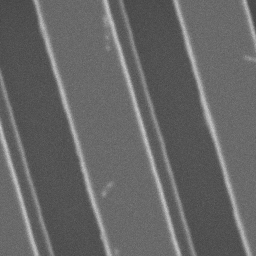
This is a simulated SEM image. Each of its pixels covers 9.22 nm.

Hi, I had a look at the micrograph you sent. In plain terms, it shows lines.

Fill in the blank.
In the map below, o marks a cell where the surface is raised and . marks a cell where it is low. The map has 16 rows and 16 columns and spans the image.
..ooooo....ooooo
...oooo....ooooo
...oooo.....oooo
...ooooo....oooo
....oooo....oooo
....oooo.....ooo
....ooooo....ooo
....ooooo....ooo
.....oooo....ooo
o....oooo.....oo
o....ooooo....oo
o.....oooo....oo
o.....oooo.....o
oo....ooooo....o
oo....ooooo....o
oo.....oooo....o